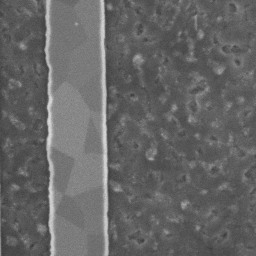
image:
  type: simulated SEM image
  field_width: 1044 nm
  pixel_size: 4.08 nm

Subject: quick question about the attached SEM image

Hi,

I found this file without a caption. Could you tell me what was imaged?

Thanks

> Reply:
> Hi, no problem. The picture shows one or a few lines or trenches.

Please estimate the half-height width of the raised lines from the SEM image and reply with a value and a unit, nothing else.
221 nanometers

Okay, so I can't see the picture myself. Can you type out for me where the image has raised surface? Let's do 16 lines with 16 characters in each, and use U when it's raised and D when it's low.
DDDUUUDDDDDDDDDD
DDDUUUDDDDDDDDDD
DDDUUUDDDDDDDDDD
DDDUUUDDDDDDDDDD
DDDUUUDDDDDDDDDD
DDDUUUDDDDDDDDDD
DDDUUUUDDDDDDDDD
DDDUUUUDDDDDDDDD
DDDUUUUDDDDDDDDD
DDDUUUUDDDDDDDDD
DDDUUUUDDDDDDDDD
DDDUUUUDDDDDDDDD
DDDUUUUDDDDDDDDD
DDDUUUUDDDDDDDDD
DDDUUUUDDDDDDDDD
DDDUUUUDDDDDDDDD